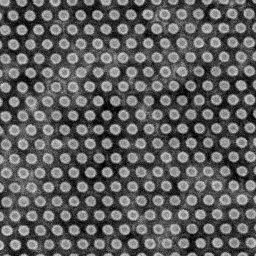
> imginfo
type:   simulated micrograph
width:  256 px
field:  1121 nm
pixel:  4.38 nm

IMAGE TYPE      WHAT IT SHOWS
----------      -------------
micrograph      a regular array of raised bodies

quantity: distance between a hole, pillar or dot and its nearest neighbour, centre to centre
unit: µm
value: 0.0715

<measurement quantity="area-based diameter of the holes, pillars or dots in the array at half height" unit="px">9.63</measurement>